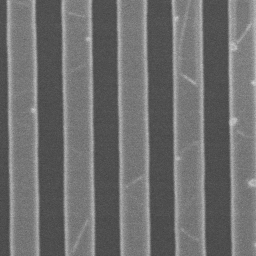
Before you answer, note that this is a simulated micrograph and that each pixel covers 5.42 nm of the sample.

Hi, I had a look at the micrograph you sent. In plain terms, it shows wiring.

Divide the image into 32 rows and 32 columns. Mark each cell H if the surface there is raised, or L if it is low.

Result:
LHHHLLLLHHHLLLLHHHLLLLHHHLLLLHHH
LHHHLLLLHHHLLLLHHHLLLLHHHLLLLHHH
LHHHLLLLHHHLLLLHHHLLLLHHHLLLLHHH
LHHHLLLLHHHLLLLHHHLLLLHHHLLLLHHH
LHHHLLLLHHHLLLLHHHLLLLHHHLLLLHHH
LHHHLLLLHHHLLLLHHHLLLLHHHLLLLHHH
LHHHLLLLHHHLLLLHHHLLLLHHHLLLLHHH
LHHHLLLLHHHLLLLHHHLLLLHHHLLLLHHH
LHHHLLLLHHHLLLLHHHLLLLHHHLLLLHHH
LHHHLLLLHHHLLLLHHHLLLLHHHLLLLHHH
LHHHLLLLHHHLLLLHHHLLLLHHHLLLLHHH
LHHHLLLLHHHLLLLHHHLLLLHHHLLLLHHH
LHHHLLLLHHHLLLLHHHLLLLHHHLLLLHHH
LHHHLLLLHHHLLLLHHHLLLLHHHLLLLHHH
LHHHLLLLHHHLLLLHHHLLLLHHHLLLLHHH
LHHHLLLLHHHLLLLHHHLLLLHHHLLLLHHH
LHHHHLLLHHHLLLLHHHLLLLHHHLLLLHHH
LHHHHLLLHHHLLLLHHHLLLLHHHLLLLHHH
LHHHLLLLHHHLLLLHHHLLLLHHHLLLLHHH
LHHHLLLLHHHLLLLHHHLLLLHHHLLLLHHH
LHHHLLLLHHHLLLLHHHLLLLHHHLLLLHHH
LHHHHLLLHHHLLLLHHHLLLLHHHLLLLHHH
LHHHHLLLHHHLLLLHHHLLLLHHHLLLLHHH
LHHHHLLLHHHLLLLHHHLLLLHHHLLLLHHH
LHHHHLLLHHHHLLLHHHLLLLHHHLLLLHHH
LHHHHLLLHHHHLLLHHHLLLLHHHLLLLHHH
LHHHHLLLHHHHLLLHHHHLLLHHHLLLLHHH
LHHHHLLLHHHHLLLHHHHLLLHHHLLLLHHH
LHHHHLLLHHHHLLLHHHHLLLHHHLLLLHHH
LHHHHLLLHHHHLLLHHHHLLLHHHLLLLHHH
LHHHHLLLHHHHLLLHHHHLLLHHHLLLLHHH
LLHHHLLLHHHHLLLHHHHLLLHHHLLLLHHH